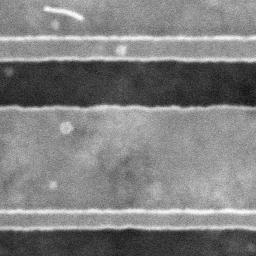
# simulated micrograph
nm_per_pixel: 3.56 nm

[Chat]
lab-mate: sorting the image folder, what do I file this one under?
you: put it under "lines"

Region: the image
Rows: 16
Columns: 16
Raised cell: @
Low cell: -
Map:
@@@@@@@@@@@@@@@@
@@@@@@@@@@@@@@@@
@@@@@@@@@@@@@@@@
@@@@@@@@@@@@@@@@
----------------
----------------
----------------
@@@@@@@@@@@@@@@@
@@@@@@@@@@@@@@@@
@@@@@@@@@@@@@@@@
@@@@@@@@@@@@@@@@
@@@@@@@@@@@@@@@@
@@@@@@@@@@@@@@@@
@@@@@@@@@@@@@@@@
----------------
----------------